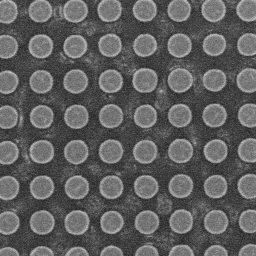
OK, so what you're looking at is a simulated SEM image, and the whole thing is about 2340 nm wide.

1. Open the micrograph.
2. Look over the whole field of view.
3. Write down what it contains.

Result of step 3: a regular array of raised bodies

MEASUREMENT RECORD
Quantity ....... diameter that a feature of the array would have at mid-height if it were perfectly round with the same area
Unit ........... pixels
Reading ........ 22.7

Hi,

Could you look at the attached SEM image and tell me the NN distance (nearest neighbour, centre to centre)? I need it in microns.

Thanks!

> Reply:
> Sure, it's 0.315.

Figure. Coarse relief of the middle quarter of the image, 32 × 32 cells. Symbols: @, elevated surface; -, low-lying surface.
--------------------------------
-------------------@@-------@@--
-@@@@-----@@@@----@@@@@----@@@@-
@@@@@@---@@@@@----@@@@@---@@@@@@
@@@@@@---@@@@@---@@@@@@---@@@@@@
@@@@@----@@@@@----@@@@@---@@@@@-
-@@@@-----@@@-----@@@@-----@@@--
--------------------------------
--------------------------------
--------------------------------
--@@-------@@------@@@------@@--
-@@@@----@@@@@----@@@@@----@@@@-
@@@@@@---@@@@@----@@@@@---@@@@@@
@@@@@@---@@@@@----@@@@@---@@@@@@
-@@@@@---@@@@@----@@@@@----@@@@-
-@@@@-----@@@------@@-------@@--
--------------------------------
--------------------------------
--------------------------------
--@@@-----@@@------@@@------@@@-
-@@@@@---@@@@@----@@@@@----@@@@@
@@@@@@---@@@@@----@@@@@---@@@@@@
@@@@@@---@@@@@----@@@@@---@@@@@@
-@@@@----@@@@@----@@@@@----@@@@-
--@@-------@@------@@@----------
--------------------------------
--------------------------------
--------------------------------
--@@@-----@@@------@@@-----@@@@-
-@@@@@---@@@@@----@@@@@----@@@@@
@@@@@@---@@@@@@---@@@@@---@@@@@@
@@@@@@---@@@@@@---@@@@@---@@@@@@